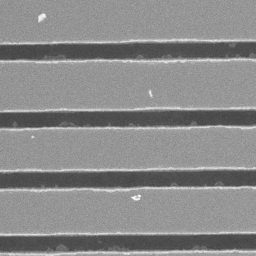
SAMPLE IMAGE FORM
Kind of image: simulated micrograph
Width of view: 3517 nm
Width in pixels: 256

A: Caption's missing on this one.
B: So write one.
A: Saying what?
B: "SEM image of lines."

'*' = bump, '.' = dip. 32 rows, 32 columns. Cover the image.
********************************
********************************
********************************
********************************
********************************
**..............................
................................
...........**.***....***********
********************************
********************************
********************************
********************************
********************************
********************************
................................
................................
********************************
********************************
********************************
********************************
********************************
**..............................
................................
................****************
********************************
********************************
********************************
********************************
********************************
................................
................................
.........***********************